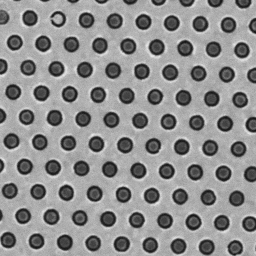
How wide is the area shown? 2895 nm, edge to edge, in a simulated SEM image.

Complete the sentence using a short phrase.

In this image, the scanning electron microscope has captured a regular array of ring-shaped grooves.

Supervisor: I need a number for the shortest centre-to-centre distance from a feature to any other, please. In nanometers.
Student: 314